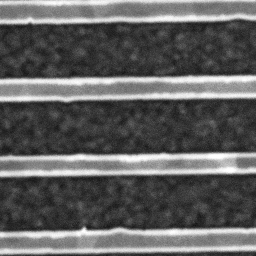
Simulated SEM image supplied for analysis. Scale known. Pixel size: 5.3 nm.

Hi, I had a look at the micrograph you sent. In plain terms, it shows one or a few lines or trenches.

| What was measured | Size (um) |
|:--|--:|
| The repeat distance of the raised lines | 0.406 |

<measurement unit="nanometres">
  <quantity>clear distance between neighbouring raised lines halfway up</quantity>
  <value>314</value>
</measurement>